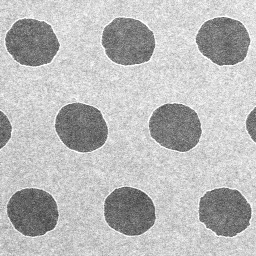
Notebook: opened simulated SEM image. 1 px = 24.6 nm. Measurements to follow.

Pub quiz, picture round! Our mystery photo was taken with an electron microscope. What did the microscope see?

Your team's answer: a regular array of holes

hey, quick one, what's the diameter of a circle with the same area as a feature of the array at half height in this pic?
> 1260 nanometers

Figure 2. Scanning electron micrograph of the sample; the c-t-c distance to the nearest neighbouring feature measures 2350 nm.